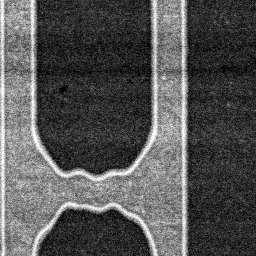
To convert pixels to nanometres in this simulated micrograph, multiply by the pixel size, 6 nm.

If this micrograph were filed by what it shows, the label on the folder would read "one or a few lines or trenches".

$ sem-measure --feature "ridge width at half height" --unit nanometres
179